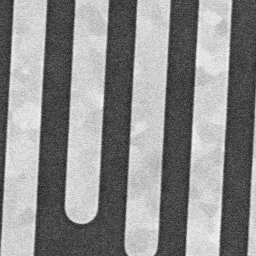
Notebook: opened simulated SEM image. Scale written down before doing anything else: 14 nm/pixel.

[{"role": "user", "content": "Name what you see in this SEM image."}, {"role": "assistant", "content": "groups of lines, slits or small figures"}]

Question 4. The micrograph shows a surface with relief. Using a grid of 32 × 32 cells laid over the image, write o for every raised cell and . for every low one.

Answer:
..oooo...ooooo...oooo....oooo...
..oooo...oooo....oooo....oooo...
..oooo...oooo....oooo....oooo...
..oooo...oooo....oooo....oooo...
..oooo...oooo....oooo....oooo...
..oooo...oooo....oooo....oooo...
..ooo....oooo....oooo....ooo....
.oooo....oooo....oooo....ooo....
.oooo....oooo....oooo....ooo....
.oooo....oooo....oooo....ooo....
.oooo....oooo....oooo...oooo....
.oooo....oooo....oooo...oooo....
.oooo....oooo....oooo...oooo....
.oooo....oooo....ooo....oooo....
.oooo....oooo....ooo....oooo....
.oooo....oooo...oooo....oooo....
.oooo....oooo...oooo....oooo....
.oooo....oooo...oooo....oooo....
.oooo....oooo...oooo....oooo....
.oooo...ooooo...oooo....oooo....
.oooo...oooo....oooo....oooo....
.oooo...oooo....oooo....oooo....
.oooo...oooo....oooo....oooo...o
.oooo...oooo....oooo....oooo...o
.oooo...oooo....oooo....oooo...o
oooo....oooo....oooo....oooo...o
oooo....oooo....oooo....oooo...o
oooo.....oo.....oooo....ooo....o
oooo............oooo...oooo....o
oooo............oooo...oooo....o
oooo............oooo...oooo....o
oooo............ooo....oooo....o